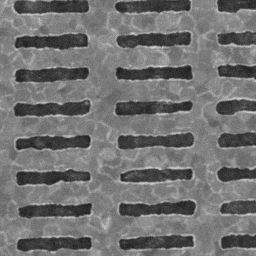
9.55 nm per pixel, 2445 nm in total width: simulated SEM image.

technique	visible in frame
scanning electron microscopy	a regular array of holes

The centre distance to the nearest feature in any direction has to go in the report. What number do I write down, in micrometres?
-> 0.32